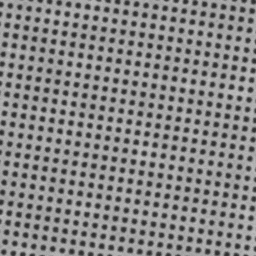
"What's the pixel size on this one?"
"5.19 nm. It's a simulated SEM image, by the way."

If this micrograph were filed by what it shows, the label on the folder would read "a regular array of holes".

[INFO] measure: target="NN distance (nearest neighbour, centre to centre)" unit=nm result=49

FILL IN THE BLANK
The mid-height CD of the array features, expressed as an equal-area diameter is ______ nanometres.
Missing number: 32.1